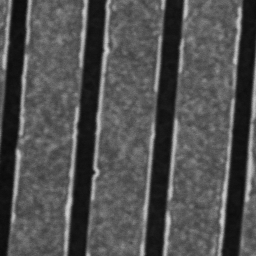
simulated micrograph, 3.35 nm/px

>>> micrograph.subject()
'one or a few lines or trenches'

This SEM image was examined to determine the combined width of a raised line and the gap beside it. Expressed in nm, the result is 258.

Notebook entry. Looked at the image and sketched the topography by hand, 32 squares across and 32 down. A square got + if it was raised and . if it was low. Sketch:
+...+++++++..++++++++..+++++++..
+..++++++++..+++++++...+++++++..
+..++++++++..+++++++...+++++++..
+..++++++++..+++++++...+++++++..
+..++++++++..+++++++...+++++++..
+..++++++++..+++++++...+++++++..
+..++++++++..+++++++..++++++++..
+..+++++++...+++++++..++++++++..
+..+++++++...+++++++..++++++++..
+..+++++++...+++++++..++++++++..
+..+++++++...+++++++..+++++++...
+..+++++++..++++++++..+++++++...
+..+++++++..++++++++..+++++++..+
...+++++++..+++++++...+++++++..+
..++++++++..+++++++...+++++++..+
...+++++++..+++++++...+++++++..+
..++++++++..+++++++...+++++++..+
..++++++++..+++++++...+++++++..+
..++++++++..+++++++..++++++++..+
..+++++++...+++++++..++++++++..+
..+++++++...+++++++..++++++++..+
..+++++++...+++++++..++++++++..+
..+++++++...+++++++..+++++++...+
..+++++++..++++++++..+++++++...+
..+++++++..++++++++..+++++++...+
..+++++++..+++++++...+++++++..++
.++++++++..+++++++...+++++++..++
.++++++++..+++++++...+++++++..++
.++++++++..+++++++...+++++++..++
.++++++++..+++++++...+++++++..++
.++++++++..+++++++..++++++++..++
.+++++++...+++++++..++++++++..++